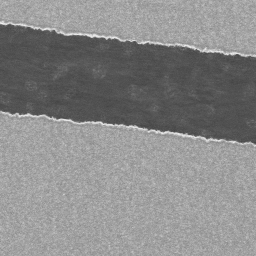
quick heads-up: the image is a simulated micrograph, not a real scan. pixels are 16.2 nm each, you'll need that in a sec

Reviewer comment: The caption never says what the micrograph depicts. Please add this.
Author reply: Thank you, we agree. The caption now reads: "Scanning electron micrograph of one or a few lines or trenches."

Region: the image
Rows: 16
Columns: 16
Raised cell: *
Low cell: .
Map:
****************
.***************
........********
................
................
................
................
****............
************....
****************
****************
****************
****************
****************
****************
****************